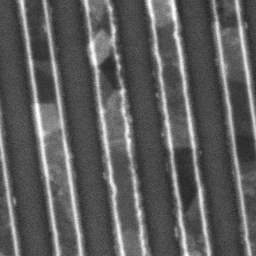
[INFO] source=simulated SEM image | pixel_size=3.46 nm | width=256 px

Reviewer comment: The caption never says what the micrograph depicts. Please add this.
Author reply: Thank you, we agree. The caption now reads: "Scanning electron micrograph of one or a few lines or trenches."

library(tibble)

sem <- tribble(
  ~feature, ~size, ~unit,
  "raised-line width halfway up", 81.5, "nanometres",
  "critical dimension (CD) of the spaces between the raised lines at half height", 138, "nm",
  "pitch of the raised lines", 219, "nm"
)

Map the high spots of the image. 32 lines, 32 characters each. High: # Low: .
...###.....###.....###.....###..
...###.....###.....###.....###..
...###.....###.....###.....###..
...###.....###.....###.....###..
...###.....###.....###.....###..
...###.....###.....###.....###..
....###.....##......###.....###.
....###.....###.....###.....###.
....###.....###.....###.....###.
....###.....###.....###.....###.
....###.....###.....###.....###.
....###.....###.....###.....###.
....###.....###......##.....###.
.....###.....##......##......###
.....###.....###.....###.....###
.....###.....###.....###.....###
.....###.....###.....###.....###
.....###.....###.....###.....###
.....###.....###.....###.....###
.....###......##.....###.....###
#.....###.....###.....##......##
#.....###.....###.....###.....##
#.....###.....###.....###.....##
#.....###.....###.....###.....##
#.....###.....###.....###.....##
#.....###.....###.....###.....##
#.....###.....###.....###.....##
##.....###.....###.....###.....#
##.....###.....###.....###.....#
##.....###.....###.....###.....#
##.....###.....###.....###.....#
##.....###.....###.....###.....#